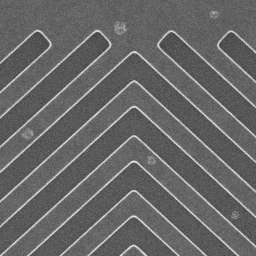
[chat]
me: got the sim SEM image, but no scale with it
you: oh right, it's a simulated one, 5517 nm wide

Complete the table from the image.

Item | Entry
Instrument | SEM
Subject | groups of lines, slits or small figures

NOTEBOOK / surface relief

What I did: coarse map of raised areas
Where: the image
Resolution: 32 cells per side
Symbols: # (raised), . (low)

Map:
################################
################################
################################
################################
####..#####..########.######..##
###...####....######...####....#
##....###....########...####....
....####....###...####....###...
...####....###.....####....###..
..####....###.......####....###.
.####....###....#....####....###
####....###....###....####....##
##....####....######....###....#
#....####....########....###....
....####....###...####....###...
...####....###.....####....###..
..####....###.......####....###.
.###....####....##...####....###
###....####....####....###....##
##....####....######....###....#
#....####....###.####....###....
....####....###...####....###...
...###....####.....####....###..
..###....####........###....####
.###....####....##....###....###
###....####....####....###....##
##....####....######....###....#
#....###....####.####....###....
....###....####...####....###...
...###....####......###....####.
..###....####........###....####
.###....####....##....###....###